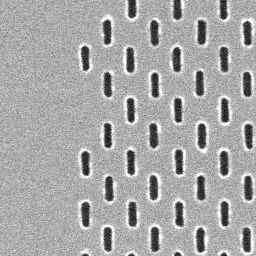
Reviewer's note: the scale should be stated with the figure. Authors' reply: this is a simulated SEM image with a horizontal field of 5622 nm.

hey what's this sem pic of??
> a regular array of holes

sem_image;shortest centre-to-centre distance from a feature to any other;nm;747